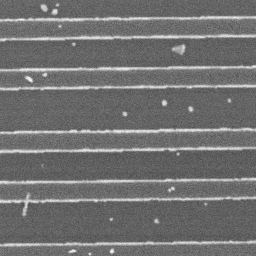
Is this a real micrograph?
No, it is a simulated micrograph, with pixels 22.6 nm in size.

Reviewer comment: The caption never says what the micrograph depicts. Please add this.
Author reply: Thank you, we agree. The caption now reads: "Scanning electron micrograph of lines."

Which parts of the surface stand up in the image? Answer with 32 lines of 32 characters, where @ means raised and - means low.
--------------------------------
--------------------------------
---@@@@@@@@@@@@@@@@@@@@@@@@@@@@@
@@@@@@@@@@@@@@@@@@@@@@@@@@@@@@@@
@@@@@@@@@@@@@@@@@@@@@@@@@@@@@@@@
--------------------------------
--------------------------------
--------------------------------
---------------------@@@@@@@@@@@
@@@@@@@@@@@@@@@@@@@@@@@@@@@@@@@@
@@@@@@@@@@@@@@@@@@@@@@@@@@@@@@@@
--------------------------------
--------------------------------
--------------------------------
--------------------------------
--------------------------------
--@@@@@@@@@@@@@@@@@@@@@@@@@@@@@@
@@@@@@@@@@@@@@@@@@@@@@@@@@@@@@@@
@@@@@@@@@@@@@@@@@@@@@@@@@@@@@@@@
--------------------------------
--------------------------------
--------------------------------
--------------------@@@@@@@@@@@@
@@@@@@@@@@@@@@@@@@@@@@@@@@@@@@@@
@@@@@@@@@@@@@@@@@@@@@@@@@@@@@@@@
--------------------------------
--------------------------------
--------------------------------
--------------------------------
--------------------------------
---------@--@@@@@@@@@@@@@@@@@@@@
@@@@@@@@@@@@@@@@@@@@@@@@@@@@@@@@